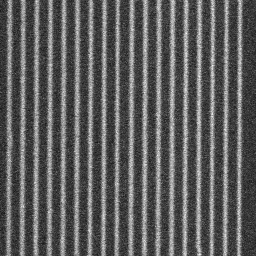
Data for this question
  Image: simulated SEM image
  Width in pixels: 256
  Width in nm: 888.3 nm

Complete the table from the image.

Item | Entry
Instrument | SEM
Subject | parallel lines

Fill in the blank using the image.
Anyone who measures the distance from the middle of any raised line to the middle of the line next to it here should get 47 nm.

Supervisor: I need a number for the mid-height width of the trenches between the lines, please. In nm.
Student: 33.8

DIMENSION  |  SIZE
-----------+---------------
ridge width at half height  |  13.4 nm